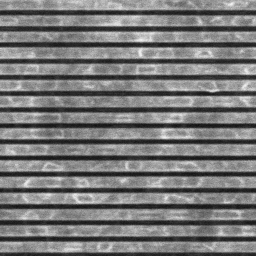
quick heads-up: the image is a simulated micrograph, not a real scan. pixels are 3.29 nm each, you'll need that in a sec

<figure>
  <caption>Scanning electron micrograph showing parallel lines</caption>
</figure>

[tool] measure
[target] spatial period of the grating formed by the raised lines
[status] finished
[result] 16.1 pixels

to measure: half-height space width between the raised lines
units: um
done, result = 0.0177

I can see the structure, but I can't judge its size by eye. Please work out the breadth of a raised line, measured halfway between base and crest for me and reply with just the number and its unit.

10.9 pixels